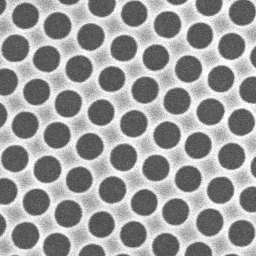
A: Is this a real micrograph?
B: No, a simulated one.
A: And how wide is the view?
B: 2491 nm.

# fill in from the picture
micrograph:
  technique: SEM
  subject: a regular array of holes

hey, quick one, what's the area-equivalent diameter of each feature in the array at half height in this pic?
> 0.271 µm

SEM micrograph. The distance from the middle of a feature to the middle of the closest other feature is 327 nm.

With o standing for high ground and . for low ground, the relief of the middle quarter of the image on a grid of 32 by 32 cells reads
.......oooo.oooooooo.....ooo....
.......oo......oooooo...oooo....
.......oo......ooooooooooooo....
o.....oo.......oooo...oooooo....
oo...ooo.......oo......ooooooo..
ooooooooo......oo.......oooooooo
..oooooooo....ooo.......oo.....o
....ooooooooooooo.......o......o
....ooooooooooooo......oo.......
.....oo.....oooooo....ooo.......
....oo......ooooooooooooo.......
....oo.......oooo.ooooooo......o
...ooo.......oo.....ooooooo...oo
.ooooo......oo.......ooooooooooo
ooooooo.....oo.......oooo..ooooo
.oooooooo.oooo.......oo.....oooo
.ooooooooooooo.......oo......ooo
..ooo...ooooooo.....oo.......ooo
..oo.....oooooooo.oooo.......oo.
.oo.......ooooooooooooo......o..
ooo.......ooo....oooooo.....oo..
ooo.......oo......oooooooooooo..
ooo......oo.......ooooooooooooo.
oooo....ooo.......ooo....ooooooo
oooooooooooo......oo......oooooo
oooooooooooo......oo......oooo..
o.....ooooooo....oo.......oo....
o......ooooooooooooo......oo....
.......ooo....oooooo.....ooo....
.......oo......ooooooooooooo....
o......oo......ooooooooooooo....
o.....ooo.......ooo...ooooooo...